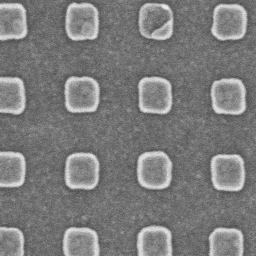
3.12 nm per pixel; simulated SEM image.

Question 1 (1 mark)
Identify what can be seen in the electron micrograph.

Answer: a regular array of raised bodies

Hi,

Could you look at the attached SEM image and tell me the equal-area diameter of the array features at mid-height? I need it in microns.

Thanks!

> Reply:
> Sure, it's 0.11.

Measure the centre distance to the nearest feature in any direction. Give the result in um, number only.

0.227